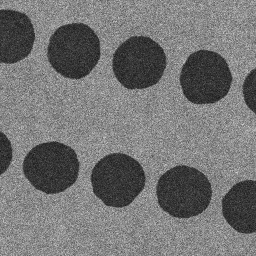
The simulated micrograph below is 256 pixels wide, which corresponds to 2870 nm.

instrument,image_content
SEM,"holes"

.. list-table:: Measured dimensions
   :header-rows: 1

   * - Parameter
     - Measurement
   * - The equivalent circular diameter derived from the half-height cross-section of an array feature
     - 604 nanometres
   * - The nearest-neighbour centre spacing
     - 0.753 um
